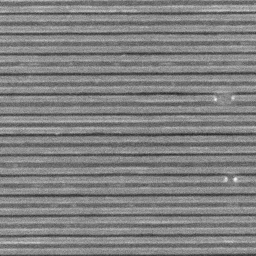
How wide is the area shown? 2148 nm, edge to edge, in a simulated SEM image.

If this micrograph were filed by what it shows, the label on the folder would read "parallel lines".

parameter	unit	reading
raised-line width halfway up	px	5.76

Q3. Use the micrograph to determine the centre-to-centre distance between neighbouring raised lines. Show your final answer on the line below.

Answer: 84.8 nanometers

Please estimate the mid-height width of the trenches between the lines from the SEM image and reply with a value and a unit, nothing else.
47.2 nanometers